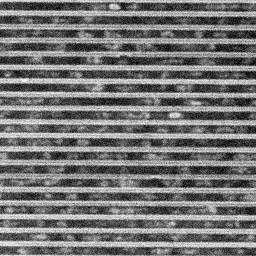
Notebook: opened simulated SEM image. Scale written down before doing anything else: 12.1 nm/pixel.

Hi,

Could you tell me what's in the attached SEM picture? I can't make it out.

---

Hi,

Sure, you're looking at parallel lines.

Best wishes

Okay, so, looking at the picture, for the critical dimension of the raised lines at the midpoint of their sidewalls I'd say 36.3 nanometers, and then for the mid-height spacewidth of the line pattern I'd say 119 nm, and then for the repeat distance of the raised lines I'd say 164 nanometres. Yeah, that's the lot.